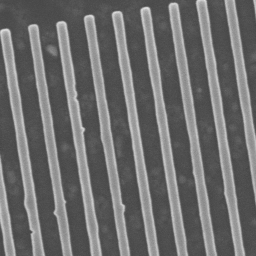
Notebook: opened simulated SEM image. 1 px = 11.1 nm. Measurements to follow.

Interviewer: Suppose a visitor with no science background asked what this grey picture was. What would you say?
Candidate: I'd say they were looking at parallel lines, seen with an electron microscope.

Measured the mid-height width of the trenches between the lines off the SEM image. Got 214 nanometres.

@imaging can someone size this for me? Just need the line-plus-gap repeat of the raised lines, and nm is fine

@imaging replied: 315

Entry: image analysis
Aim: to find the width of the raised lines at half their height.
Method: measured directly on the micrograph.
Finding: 9.51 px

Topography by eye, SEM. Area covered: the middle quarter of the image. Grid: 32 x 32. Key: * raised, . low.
**.....**.....**.....***....***.
**.....**.....***....***.....**.
**.....**......**.....**.....**.
***....***.....**.....**.....**.
***....***.....**.....**.....**.
.**.....**.....**.....**.....***
.**.....**.....**.....**.....***
.**.....**.....**......*......**
.**.....**.....***.....**.....**
.**.....***.....**.....**.....**
.***....***.....**.....**.....**
.***.....**.....**.....**.....**
..**.....**.....**.....**.....**
..**.....**.....**.....***....**
..**.....**.....**.....***.....*
..**.....**.....***.....**.....*
..***....***.....**.....**.....*
..***....***.....**.....**.....*
..***....***.....**.....**.....*
...**.....**.....**.....**......
...**.....**.....**.....***.....
...**.....**.....***.....**.....
...**.....***.....**.....**.....
...**.....***.....**.....**.....
....*......**.....**.....**.....
....**.....**.....**.....**.....
....**.....**.....**.....***....
....**.....**.....***....***....
....**.....**.....***.....**....
....**......**.....**.....**....
.....*.....***.....**.....**....
.....**.....**.....**.....**....